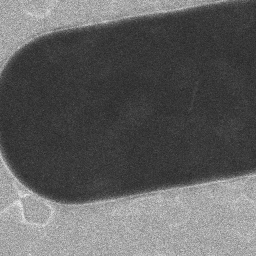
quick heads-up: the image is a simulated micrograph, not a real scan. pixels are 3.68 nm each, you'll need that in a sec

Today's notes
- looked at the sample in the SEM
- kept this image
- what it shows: one or a few lines or trenches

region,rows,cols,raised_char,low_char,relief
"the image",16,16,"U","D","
DDDDDDDDDDDUUUUU
DDDDDDUUUUUUUUUU
DDUUUUUUUUUUUUUU
DUUUUUUUUUUUUUUU
UUUUUUUUUUUUUUUU
UUUUUUUUUUUUUUUU
UUUUUUUUUUUUUUUU
UUUUUUUUUUUUUUUU
UUUUUUUUUUUUUUUU
UUUUUUUUUUUUUUUU
UUUUUUUUUUUUUUUU
DUUUUUUUUUUUUDDD
DDDUUUUDDDDDDDDD
DDDDDDDDDDDDDDDD
DDDDDDDDDDDDDDDD
DDDDDDDDDDDDDDDD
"